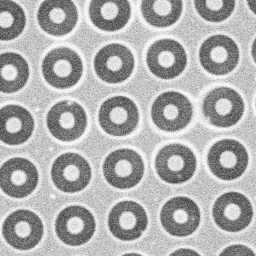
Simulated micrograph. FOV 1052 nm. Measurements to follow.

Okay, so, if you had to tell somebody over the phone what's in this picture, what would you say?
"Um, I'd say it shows an array of small figures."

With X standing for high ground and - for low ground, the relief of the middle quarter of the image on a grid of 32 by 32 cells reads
X----XX----XXX----XXX----X-----X
XX---XX----------XXXX---------XX
X----XXX---------XXXXX-------XXX
-----XXXX-------XXXXXXXX----XXXX
----XXXXXX-----XXXXXXXXXXXXXXXXX
---XXXXXXXXXXXXXXXXXXXXXXXXXXXXX
-XXXXXXXXXXXXXXXXXXXXXXXXXXXXXXX
XXXXXXXXXXXXXXXXXXXXXXXX------XX
XXXXXXXXXXX------XXXXXX--------X
---XXXXXXX--------XXXX----------
----XXXXX---------XXXX----XX----
-----XXXX---XXX----XXX---XXX----
XX----XX----XXXX---XXX---XXX----
XX----XX----XXX----XXX----XX----
XX----XX----XXX----XXX----------
XX----XXX----------XXX---------X
------XXX---------XXXXXX------XX
-----XXXXXX------XXXXXXXXX-XXXXX
----XXXXXXXXXXXXXXXXXXXXXXXXXXXX
--XXXXXXXXXXXXXXXXXXXXXXXXX--XXX
XXXXXXXXXXXXXXXXXXXXXXXX-------X
XXXXXXXXXXXX------XXXXX---------
----XXXXXXX--------XXXX---------
-----XXXXX----------XX-----XX---
------XXXX----XX----XX----XXXX--
------XXXX---XXXX---XX----XXXX--
XXX----XXX---XXXX---XXX----XX---
XXXX---XXX---XXX----XXX---------
-XX----XXX----------XXXX--------
-------XXXX--------XXXXXX-----XX
------XXXXXX------XXXXXXXXXXXXXX
-----XXXXXXXXX-XXXXXXXXXXXXXXXXX